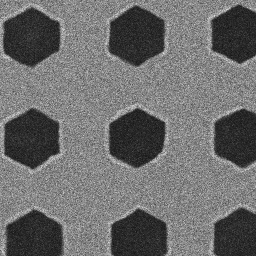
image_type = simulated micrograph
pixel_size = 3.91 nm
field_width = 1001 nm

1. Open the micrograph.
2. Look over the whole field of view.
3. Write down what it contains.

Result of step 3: holes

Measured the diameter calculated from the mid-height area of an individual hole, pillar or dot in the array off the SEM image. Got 221 nanometers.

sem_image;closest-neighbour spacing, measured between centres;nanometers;398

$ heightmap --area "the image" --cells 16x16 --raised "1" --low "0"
1111111101111111
0000111000111000
0000111000111000
1001111000111100
1111111111111111
1111111111111111
1111111111111111
1001111000111100
0000111000111000
0000111000111100
1111111111111111
1111111111111111
1111111111111111
1001111100111100
0000111000111000
0000111000111000